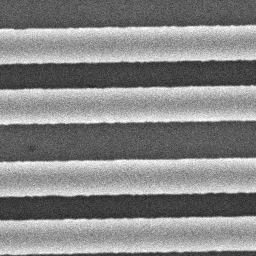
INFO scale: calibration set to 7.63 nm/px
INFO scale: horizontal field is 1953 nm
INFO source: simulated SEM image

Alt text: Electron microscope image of lines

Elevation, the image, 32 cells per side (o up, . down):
................................
................................
................................
.............ooooooooooooooooooo
oooooooooooooooooooooooooooooooo
oooooooooooooooooooooooooooooooo
oooooooooooooooooooooooooooooooo
oooooooooooooooooooooooooooooooo
................................
................................
................................
oooooooooooooooooooooooooooooooo
oooooooooooooooooooooooooooooooo
oooooooooooooooooooooooooooooooo
oooooooooooooooooooooooooooooooo
o...............................
................................
................................
................................
................................
oooooooooooooooooooooooooooooooo
oooooooooooooooooooooooooooooooo
oooooooooooooooooooooooooooooooo
oooooooooooooooooooooooooooooooo
ooooo...o.......................
................................
................................
........oooooooooooooooooooooooo
oooooooooooooooooooooooooooooooo
oooooooooooooooooooooooooooooooo
oooooooooooooooooooooooooooooooo
ooooooooooooooo.o...............